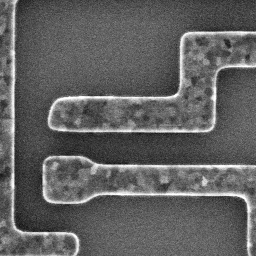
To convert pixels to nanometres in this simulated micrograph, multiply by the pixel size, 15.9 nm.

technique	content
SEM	wiring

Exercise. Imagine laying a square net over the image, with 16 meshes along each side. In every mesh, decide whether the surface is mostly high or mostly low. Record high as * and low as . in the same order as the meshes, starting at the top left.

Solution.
*...............
*...............
*..........*****
*..........*****
*..........***..
*..........**...
*..**********...
*..**********...
*...............
*...............
*..*************
*..*************
*..**..........*
*...............
**..............
*****...........